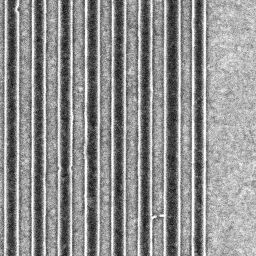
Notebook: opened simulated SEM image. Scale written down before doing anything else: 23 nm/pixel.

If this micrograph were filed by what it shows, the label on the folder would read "parallel lines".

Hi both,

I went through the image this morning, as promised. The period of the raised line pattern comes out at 615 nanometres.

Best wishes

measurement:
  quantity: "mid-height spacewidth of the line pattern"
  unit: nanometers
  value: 290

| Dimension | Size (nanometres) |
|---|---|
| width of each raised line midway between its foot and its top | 313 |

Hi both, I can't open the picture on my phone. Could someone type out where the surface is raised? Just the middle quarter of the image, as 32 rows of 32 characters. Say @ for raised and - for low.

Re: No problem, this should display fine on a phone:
@@----@@@---@@@----@@@---@@@@---
@@----@@@---@@@----@@@---@@@@---
@@----@@@---@@@----@@@---@@@@---
@@----@@@---@@@----@@@---@@@@---
@@----@@@---@@@----@@@---@@@@---
@@----@@@---@@@----@@@---@@@@---
@@----@@@---@@@----@@@---@@@@---
@@----@@@---@@@----@@@---@@@@---
@@----@@@---@@@----@@@---@@@@---
@@----@@@---@@@----@@@---@@@@---
@@----@@@---@@@----@@@---@@@@---
@@---@@@@---@@@----@@@---@@@@---
@@---@@@@---@@@----@@@---@@@@---
@@----@@@---@@@----@@@---@@@@---
@@----@@@---@@@----@@@---@@@@---
@@----@@@---@@@----@@@---@@@@---
@@----@@@---@@@----@@@---@@@@---
@@----@@@---@@@----@@@---@@@@---
@@----@@@---@@@----@@@---@@@@---
@@---@@@@---@@@----@@@---@@@@---
@@---@@@@---@@@----@@@---@@@@---
@@---@@@@---@@@----@@@---@@@@---
@@---@@@@---@@@----@@@---@@@@---
@@---@@@@---@@@----@@@---@@@@---
@@----@@@---@@@----@@@---@@@@---
@@----@@@---@@@----@@@---@@@@---
@@----@@@---@@@----@@@---@@@@---
@@----@@@---@@@----@@@---@@@@---
@@----@@@---@@@----@@@---@@@@---
@@----@@@---@@@----@@@---@@@@---
@@----@@@---@@@----@@@---@@@@---
@@----@@@---@@@----@@@---@@@@---